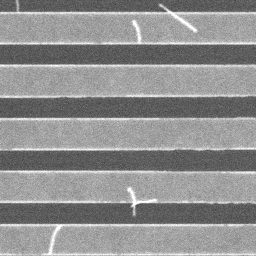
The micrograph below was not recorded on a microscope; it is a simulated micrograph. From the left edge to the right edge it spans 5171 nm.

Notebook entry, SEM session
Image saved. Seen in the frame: lines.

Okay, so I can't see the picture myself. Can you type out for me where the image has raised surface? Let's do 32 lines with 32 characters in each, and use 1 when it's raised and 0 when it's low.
00000000000000000000000000000000
00000000000000000000010000000000
11111111111111111111111111111111
11111111111111111111111111111111
11111111111111111111111111111111
00000000000000000000000000000000
00000000000000000000000000000000
00000000000000000000000000000000
11111111111111111111111111111111
11111111111111111111111111111111
11111111111111111111111111111111
11111111111111111111111111111111
00000000000000000000000000000000
00000000000000000000000000000000
00000000000000000000000000000000
11111111111111111111111111111111
11111111111111111111111111111111
11111111111111111111111111111111
11111111111111111111111111111111
00000000000000000000000000000000
00000000000000000000000000000000
11111111111111111100000000000000
11111111111111111111111111111111
11111111111111111111111111111111
11111111111111111111111111111111
00000000000000000000000000000000
00000000000000000000000000000000
00000000000000000000000000000000
11111111111111111111111111111111
11111111111111111111111111111111
11111111111111111111111111111111
11111111111111111111111111111111